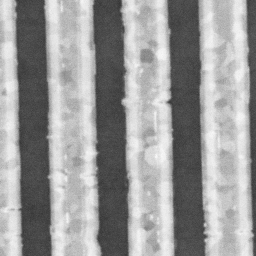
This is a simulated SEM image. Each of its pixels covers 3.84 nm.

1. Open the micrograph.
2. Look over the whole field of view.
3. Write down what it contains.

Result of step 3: one or a few lines or trenches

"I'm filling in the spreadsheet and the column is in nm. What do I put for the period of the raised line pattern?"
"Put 296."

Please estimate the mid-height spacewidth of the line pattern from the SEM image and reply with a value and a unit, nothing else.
0.18 um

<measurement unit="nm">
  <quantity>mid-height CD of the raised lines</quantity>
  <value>115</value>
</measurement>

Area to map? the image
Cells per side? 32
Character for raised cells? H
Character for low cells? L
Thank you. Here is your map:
HLLLLLLHHHHLLLLLHHHHLLLLLLHHHHLL
HLLLLLLHHHHLLLLLHHHHLLLLLLHHHHLL
HLLLLLLHHHHLLLLLHHHHLLLLLLHHHHLL
HLLLLLLHHHHLLLLLHHHHLLLLLLHHHHLL
HLLLLLLHHHHLLLLLLHHHLLLLLLHHHHLL
HLLLLLLHHHHLLLLLLHHHLLLLLLHHHHLL
HLLLLLLHHHHLLLLLLHHHLLLLLLHHHHLL
HLLLLLLHHHHLLLLLHHHHLLLLLLHHHHLL
HLLLLLLHHHHLLLLLLHHHLLLLLLHHHHLL
HLLLLLLHHHHLLLLLLHHHLLLLLLHHHHLL
HLLLLLLHHHHLLLLLLHHHLLLLLLHHHHLL
HLLLLLLHHHHLLLLLLHHHLLLLLLHHHHLL
HLLLLLLHHHHLLLLLHHHHLLLLLLHHHHLL
HLLLLLLHHHHLLLLLLHHHLLLLLLHHHHLL
HLLLLLLHHHHLLLLLLHHHLLLLLLHHHHLL
HLLLLLLHHHHLLLLLLHHHLLLLLLHHHHLL
HLLLLLLHHHHLLLLLLHHHLLLLLLHHHHLL
HLLLLLLHHHHLLLLLLHHHLLLLLLHHHHLL
HLLLLLLHHHHLLLLLLHHHHLLLLLHHHHLL
HLLLLLLHHHHLLLLLLHHHHLLLLLHHHHLL
HLLLLLLHHHHLLLLLLHHHHLLLLLHHHHLL
HLLLLLLHHHHLLLLLLHHHHLLLLLLHHHLL
HLLLLLLHHHHLLLLLLHHHHLLLLLHHHHLL
HLLLLLLHHHHLLLLLLHHHHLLLLLHHHHLL
HLLLLLLHHHHLLLLLLHHHHLLLLLLHHHLL
HHLLLLLHHHHLLLLLLHHHHLLLLLLHHHLL
HLLLLLLHHHHLLLLLLHHHHLLLLLLHHHLL
HHLLLLLHHHHLLLLLLHHHHLLLLLLHHHLL
HHLLLLLHHHHLLLLLLHHHHLLLLLLHHHLL
HLLLLLLHHHHLLLLLLHHHHLLLLLLHHHHL
HHLLLLLHHHHLLLLLLHHHHLLLLLLHHHLL
HHLLLLLLHHHHLLLLLHHHHLLLLLLHHHLL